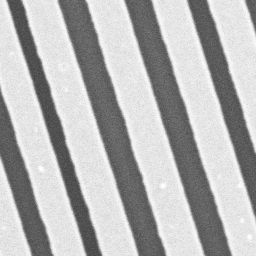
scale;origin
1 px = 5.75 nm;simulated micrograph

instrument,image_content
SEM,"lines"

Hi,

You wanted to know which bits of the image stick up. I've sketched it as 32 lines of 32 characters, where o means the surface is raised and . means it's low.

o..oooo....ooooo...oooo...ooooo.
o..ooooo...ooooo...ooooo..ooooo.
oo..oooo....oooo....oooo...oooo.
oo..oooo....ooooo...oooo...ooooo
oo..ooooo...ooooo...ooooo..ooooo
oo..ooooo....oooo....oooo...oooo
ooo..oooo....oooo....oooo...oooo
ooo..ooooo...ooooo...ooooo..oooo
ooo..ooooo...ooooo....oooo...ooo
oooo..oooo....oooo....oooo...ooo
oooo..oooo....ooooo...ooooo..ooo
oooo..ooooo...ooooo....oooo...oo
.oooo..oooo....oooo....oooo...oo
.oooo..oooo....ooooo...oooo...oo
.oooo..ooooo...ooooo....oooo...o
..oooo..oooo....oooo....oooo...o
..oooo..oooo....ooooo...oooo...o
..oooo..ooooo...ooooo...ooooo...
..oooo...oooo....oooo....oooo...
...oooo..oooo....ooooo...oooo...
...oooo..ooooo...ooooo...ooooo..
o...ooo...oooo....oooo....oooo..
o...oooo..oooo....ooooo...oooo..
o...oooo..ooooo...ooooo...ooooo.
oo..oooo..ooooo....oooo....oooo.
oo...oooo..oooo....oooo....oooo.
oo...oooo..oooo....ooooo...ooooo
oo...oooo..ooooo....oooo....oooo
ooo...oooo..oooo....oooo....oooo
ooo...oooo..oooo....ooooo...oooo
ooo...oooo..ooooo...ooooo....ooo
oooo...oooo..oooo....oooo....ooo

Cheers